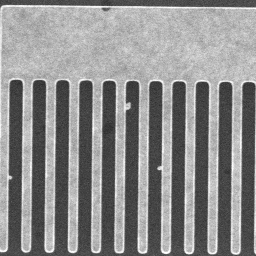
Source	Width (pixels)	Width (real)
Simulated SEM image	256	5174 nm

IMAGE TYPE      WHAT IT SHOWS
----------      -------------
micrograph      groups of lines, slits or small figures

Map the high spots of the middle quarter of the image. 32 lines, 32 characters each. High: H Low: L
HHHHHHHHHHHHHHHHHHHHHHHHHHHHHHHH
HHHHHHHHHHHHHHHHHHHHHHHHHHHHHHHH
HHHHHHHHHHHHHHHHHHHHHHHHHHHHHHHH
HHHHHHHHHHHHHHHHHHHHHHHHHHHHHHHH
LHHHLLLHHHLLLHHHLLLHHHLLHHHLLLHH
LLHHLLLHHHLLLHHLLLLHHLLLLHHLLLLH
LLHHLLLHHLLLLHHLLLLHHLLLLHHLLLLH
LHHHLLLHHLLLLHHLLLLHHLLLLHHLLLLH
LHHLLLLHHLLLLHHLLLLHHLLLLHHLLLLH
LHHLLLLHHLLLLHHLLLLHHLLLLHHLLLLH
LHHLLLLHHLLLLHHLLLLHHLLLLHHLLLLH
LHHLLLLHHLLLLHHLLLLHHLLLLHHLLLLH
LHHLLLLHHLLLLHHLLLLHHLLLLHHLLLLH
LHHLLLLHHLLLLHHLLLLHHLLLLHHLLLLH
LHHLLLLHHLLLLHHLLLLHHLLLLHHLLLLH
LHHLLLLHHLLLLHHLLLLHHLLLLHHLLLLH
LHHLLLLHHLLLLHHLLLLHHLLLLHHLLLLH
LHHLLLLHHLLLLHHLLLLHHLLLLHHLLLLH
LHHLLLLHHLLLLHHLLLLHHLLLLHHLLLLH
LHHLLLLHHLLLLHHLLLLHHLLLLHHLLLLH
LHHLLLLHHLLLLHHLLLLHHLLLLHHLLLLH
LHHLLLLHHLLLLHHLLLLHHLLLLHHLLLLH
LHHLLLLHHLLLLHHLLLLHHLLLLHHLLLHH
LHHLLLLHHLLLLHHLLLLHHLLLLHHLLLHH
LHHLLLLHHLLLLHHLLLLHHLLLLHHLLLHH
LHHLLLLHHLLLLHHLLLLHHLLLLHHLLLHH
LHHLLLLHHLLLLHHLLLLHHLLLLHHLLLHH
LHHLLLLHHLLLLHHLLLLHHLLLLHHLLLHH
LHHLLLLHHLLLLHHLLLLHHLLLLHHLLLHH
LHHLLLLHHLLLLHHLLLLHHLLLLHHLLLHH
LHHLLLLHHLLLLHHLLLLHHLLLLHHLLLHH
LHHLLLLHHLLLLHHLLLLHHLLLLHHLLLHH